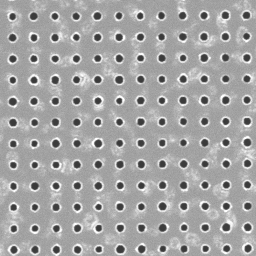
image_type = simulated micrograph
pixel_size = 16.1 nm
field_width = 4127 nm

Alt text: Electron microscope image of a regular array of holes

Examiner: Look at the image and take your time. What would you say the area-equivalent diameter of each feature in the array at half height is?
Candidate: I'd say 125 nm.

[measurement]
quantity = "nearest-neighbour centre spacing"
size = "336 nm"